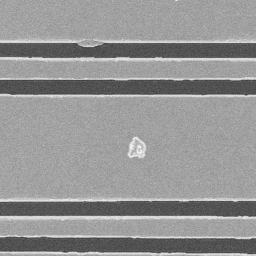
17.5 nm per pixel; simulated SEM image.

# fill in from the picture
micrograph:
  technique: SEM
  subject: lines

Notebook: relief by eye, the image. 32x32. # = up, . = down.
################################
################################
################################
################################
################################
..........###...................
................................
################################
################################
################################
................................
................................
################################
################################
################################
################################
################################
################################
################################
################################
################################
################################
################################
################################
################################
................................
................................
################################
################################
...#..##########################
................................
................................